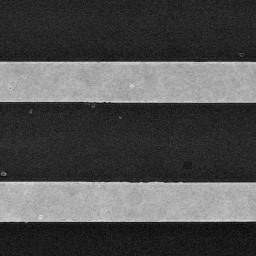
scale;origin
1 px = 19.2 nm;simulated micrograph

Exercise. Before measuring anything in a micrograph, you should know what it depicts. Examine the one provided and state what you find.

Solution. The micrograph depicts lines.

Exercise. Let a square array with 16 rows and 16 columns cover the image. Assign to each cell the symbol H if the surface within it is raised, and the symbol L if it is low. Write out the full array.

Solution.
LLLLLLLLLLLLLLLL
LLLLLLLLLLLLLLLL
LLLLLLLLLLLLLLLL
LLLLLLLLLLLLLLLL
HHHHHHHHHHHHHHHH
HHHHHHHHHHHHHHHH
LLLLLLLLLLLLLLLL
LLLLLLLLLLLLLLLL
LLLLLLLLLLLLLLLL
LLLLLLLLLLLLLLLL
LLLLLLLLLLLLLLLL
HHHHHHHHHHHHHHHH
HHHHHHHHHHHHHHHH
HHHHHHHHHHHHHHHH
LLLLLLLLLLLLLLLL
LLLLLLLLLLLLLLLL